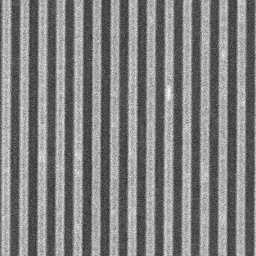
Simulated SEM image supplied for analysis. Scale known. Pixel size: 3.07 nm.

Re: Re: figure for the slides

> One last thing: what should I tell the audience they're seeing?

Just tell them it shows parallel lines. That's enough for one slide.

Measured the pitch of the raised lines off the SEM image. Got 55.5 nanometres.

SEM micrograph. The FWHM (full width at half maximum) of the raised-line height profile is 0.0246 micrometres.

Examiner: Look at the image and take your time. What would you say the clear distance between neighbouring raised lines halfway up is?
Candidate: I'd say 0.0303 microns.